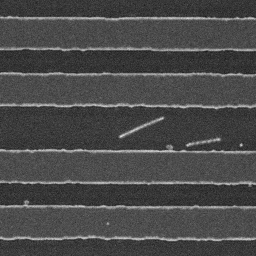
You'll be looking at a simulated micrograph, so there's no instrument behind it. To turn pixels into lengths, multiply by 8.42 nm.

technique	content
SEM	lines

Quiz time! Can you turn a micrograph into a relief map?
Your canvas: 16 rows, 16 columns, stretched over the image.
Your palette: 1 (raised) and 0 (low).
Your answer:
0000000000000000
1111111111111111
1111111111111111
0000000000000000
0000000000000000
1111111111111111
1111111111111111
0000000000000000
0000000000000000
1111111111111111
1111111111111111
0000000000000111
0000000000000000
1111111111111111
1111111111111111
0000000000000000